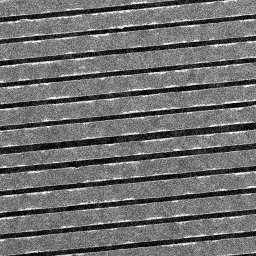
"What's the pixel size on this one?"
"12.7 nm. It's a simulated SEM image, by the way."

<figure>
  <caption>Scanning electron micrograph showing parallel lines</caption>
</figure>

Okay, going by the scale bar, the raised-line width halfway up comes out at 209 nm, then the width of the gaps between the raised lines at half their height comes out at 68.1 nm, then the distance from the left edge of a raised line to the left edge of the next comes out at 275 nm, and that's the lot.